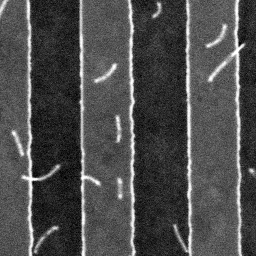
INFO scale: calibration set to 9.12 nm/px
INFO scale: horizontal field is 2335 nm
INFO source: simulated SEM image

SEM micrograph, lines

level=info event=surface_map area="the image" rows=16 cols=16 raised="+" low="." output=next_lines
++...+++....+++.
++...+++....+++.
++...+++....+++.
++...+++....+++.
++...+++....+++.
++...+++....+++.
++...+++....+++.
++...+++....+++.
++...+++....+++.
++...+++....+++.
++...+++....+++.
++...+++....+++.
++...+++....+++.
++...+++....+++.
++...+++....+++.
++...+++....+++.